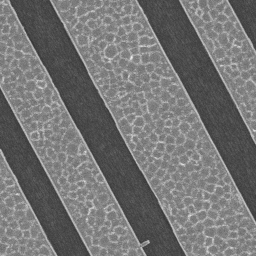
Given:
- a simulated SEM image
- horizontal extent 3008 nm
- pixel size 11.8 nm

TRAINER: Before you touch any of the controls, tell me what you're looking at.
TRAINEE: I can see one or a few lines or trenches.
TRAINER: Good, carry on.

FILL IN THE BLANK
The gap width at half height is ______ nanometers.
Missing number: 436